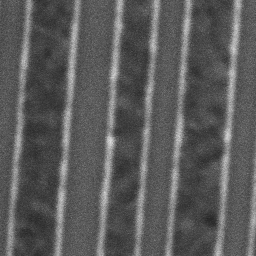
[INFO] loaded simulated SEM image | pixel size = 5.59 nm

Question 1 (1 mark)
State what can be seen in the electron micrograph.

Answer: one or a few lines or trenches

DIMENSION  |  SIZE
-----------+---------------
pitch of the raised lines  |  447 nanometers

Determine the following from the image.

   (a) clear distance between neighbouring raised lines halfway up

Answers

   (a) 0.169 µm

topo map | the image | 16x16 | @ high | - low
--@@@--@@@--@@@-
--@@@--@@@--@@@-
--@@@--@@@--@@@-
--@@@--@@@-@@@@-
-@@@@--@@--@@@@-
-@@@---@@--@@@@-
-@@@---@@--@@@--
-@@@---@@--@@@--
-@@@---@@--@@@--
-@@@---@@--@@@--
-@@@---@@--@@@--
-@@@---@@--@@@--
-@@@--@@@--@@@--
-@@@--@@@--@@@--
-@@@--@@@--@@@--
-@@@--@@@--@@@--